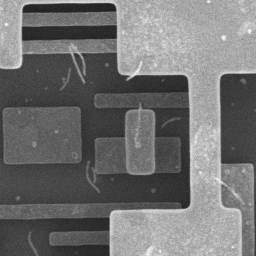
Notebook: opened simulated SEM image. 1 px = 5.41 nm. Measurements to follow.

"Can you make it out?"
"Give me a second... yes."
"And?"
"wiring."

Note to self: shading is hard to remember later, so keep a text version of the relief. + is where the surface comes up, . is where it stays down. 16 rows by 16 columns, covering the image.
++.....+++++++++
+......+++++++++
+......+++++++++
+......+++++++++
........++++++++
............++..
............++..
........++..++..
........++..++..
........++..++..
........++..++..
............++..
............++..
.......++++++++.
.......++++++++.
.......++++++++.